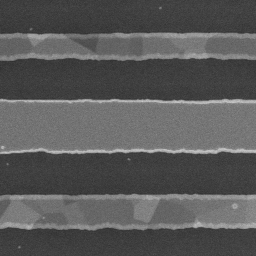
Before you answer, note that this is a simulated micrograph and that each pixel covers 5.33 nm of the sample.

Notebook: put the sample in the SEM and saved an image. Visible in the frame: lines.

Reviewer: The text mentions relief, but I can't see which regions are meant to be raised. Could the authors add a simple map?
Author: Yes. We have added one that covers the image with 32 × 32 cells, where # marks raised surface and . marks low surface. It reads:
................................
................................
................................
................................
################################
################################
################################
................................
................................
................................
................................
................................
................................
################################
################################
################################
################################
################################
################################
................................
................................
................................
................................
................................
...............##....####.......
################################
################################
################################
...#...##.##...#####.#..........
................................
................................
................................